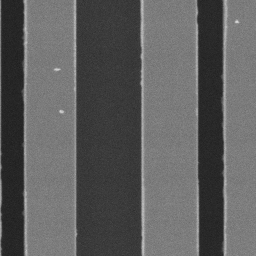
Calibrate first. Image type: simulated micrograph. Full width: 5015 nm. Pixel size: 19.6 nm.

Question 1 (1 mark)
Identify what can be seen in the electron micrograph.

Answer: lines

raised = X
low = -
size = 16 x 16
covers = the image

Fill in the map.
--XXX----XXX--XX
--XXX----XXX--XX
--XXX----XXX--XX
--XXX----XXX--XX
--XXX----XXX--XX
--XXX----XXX--XX
--XXX----XXX--XX
--XXX----XXX--XX
--XXX----XXX--XX
--XXX----XXX--XX
--XXX----XXX--XX
--XXX----XXX--XX
--XXX----XXX--XX
--XXX----XXX--XX
--XXX----XXX--XX
--XXX----XXX--XX